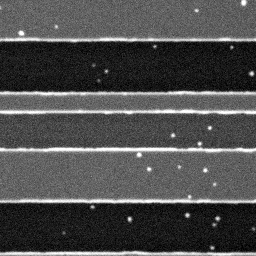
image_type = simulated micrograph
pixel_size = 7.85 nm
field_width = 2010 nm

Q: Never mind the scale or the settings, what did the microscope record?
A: lines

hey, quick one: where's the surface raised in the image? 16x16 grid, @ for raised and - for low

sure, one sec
@@@@@@@@@@@@@@@@
@@@@@@@@@@@@@@@@
@@@@@@@@@@@@@@@@
----------------
----------------
----------------
@@@@@@@@@@@@@@@@
@@@@@@@@@@@@@@@@
@@@@@@@@@@@@@@@@
@@@@@@@@@@@@@@@@
@@@@@@@@@@@@@@@@
@@@@@@@@@@@@@@@@
@@@@@@@@@@@@@@@@
----------------
----------------
----------------